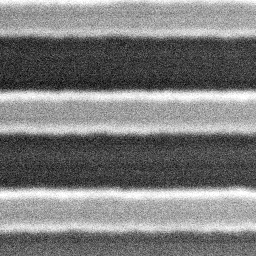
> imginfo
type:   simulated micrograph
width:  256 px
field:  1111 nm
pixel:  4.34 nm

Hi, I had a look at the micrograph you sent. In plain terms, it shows lines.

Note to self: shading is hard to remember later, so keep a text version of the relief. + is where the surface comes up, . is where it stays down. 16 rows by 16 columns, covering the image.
++++++++++++++++
++++++++++++++++
................
................
................
................
++++++++++++++++
++++++++++++++++
................
................
................
................
++++++++++++++++
++++++++++++++++
................
................